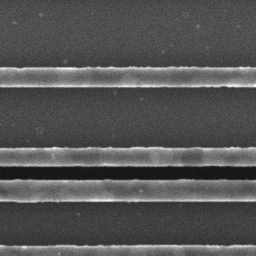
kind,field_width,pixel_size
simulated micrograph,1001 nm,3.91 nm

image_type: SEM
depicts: lines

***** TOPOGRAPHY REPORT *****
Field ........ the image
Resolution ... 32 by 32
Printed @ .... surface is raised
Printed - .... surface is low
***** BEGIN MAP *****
--------------------------------
--------------------------------
--------------------------------
--------------------------------
--------------------------------
--------------------------------
--------------------------------
--------------------------------
-----------@@@@-@-@---@@@@------
@@@@@@@@@@@@@@@@@@@@@@@@@@@@@@@@
@@@@@@@@@@@@@@@@@@@@@@@@@@@@@@@@
--------------------------------
--------------------------------
--------------------------------
--------------------------------
--------------------------------
--------------------------------
--------------------------------
------@@@--@@@--@@@@@---@@--@@-@
@@@@@@@@@@@@@@@@@@@@@@@@@@@@@@@@
@@@@@@@@@@@@@@@@@@@@@@@@@@@@@@@@
--------------------------------
-@@@---------@--@@----@@@--@@---
@@@@@@@@@@@@@@@@@@@@@@@@@@@@@@@@
@@@@@@@@@@@@@@@@@@@@@@@@@@@@@@@@
--------------------------------
--------------------------------
--------------------------------
--------------------------------
--------------------------------
--------------------------------
@@@@@@@@@@@@@@@@@@@@@@@@@@@@@@@@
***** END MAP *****